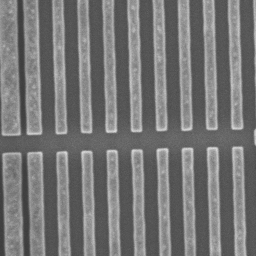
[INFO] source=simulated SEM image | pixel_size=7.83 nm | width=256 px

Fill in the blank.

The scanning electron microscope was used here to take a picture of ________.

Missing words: groups of lines, slits or small figures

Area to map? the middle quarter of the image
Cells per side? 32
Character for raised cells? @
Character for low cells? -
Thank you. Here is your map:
----@@----@@@----@@----@@----@@@
----@@----@@@----@@----@@----@@@
----@@----@@@----@@----@@----@@@
----@@----@@@----@@----@@----@@@
----@@----@@@----@@----@@----@@@
----@@----@@@----@@----@@----@@@
----@@----@@@----@@----@@----@@@
----@@-----@@----@@----@@----@@@
----@@-----@@----@@----@@----@@@
----@@-----@@----@@----@@----@@@
----@@@----@@----@@----@@----@@@
----@@@----@@----@@----@@----@@@
----@@@----@@----@@----@@----@@@
----@@@----@@----@@----@@----@@@
-----@@----@@----@@----@@-----@@
@----@@----@@----@@----@@-----@@
@----@@----@@----@@-------------
--------------------------------
--------------------------------
--------------------------------
--------------------------------
------------------------@@----@@
@----@@----@@----@@----@@@----@@
@----@@----@@----@@-----@@----@@
@----@@----@@----@@-----@@----@@
@----@@----@@----@@-----@@----@@
@----@@----@@----@@@----@@----@@
@----@@----@@----@@@----@@----@@
@----@@----@@----@@@----@@----@@
@----@@----@@----@@@----@@----@@
@----@@----@@-----@@----@@----@@
@----@@----@@-----@@----@@----@@